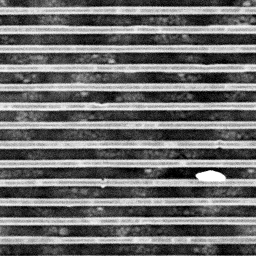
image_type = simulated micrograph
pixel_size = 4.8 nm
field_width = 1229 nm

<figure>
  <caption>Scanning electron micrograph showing parallel lines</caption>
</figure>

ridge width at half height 28.8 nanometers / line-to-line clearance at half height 61.8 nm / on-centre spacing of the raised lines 0.0917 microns